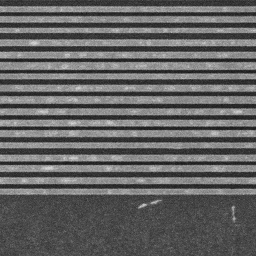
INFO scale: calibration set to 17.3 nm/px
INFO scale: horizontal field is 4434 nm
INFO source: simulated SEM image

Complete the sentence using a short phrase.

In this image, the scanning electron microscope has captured parallel lines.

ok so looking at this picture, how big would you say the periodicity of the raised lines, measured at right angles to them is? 198 nanometres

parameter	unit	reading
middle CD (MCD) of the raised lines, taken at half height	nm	115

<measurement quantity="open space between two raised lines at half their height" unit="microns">0.0823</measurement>